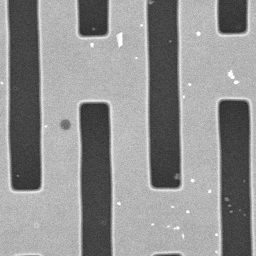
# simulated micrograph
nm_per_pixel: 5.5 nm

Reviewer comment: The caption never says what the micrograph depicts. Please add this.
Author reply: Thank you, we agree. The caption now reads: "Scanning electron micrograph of groups of lines, slits or small figures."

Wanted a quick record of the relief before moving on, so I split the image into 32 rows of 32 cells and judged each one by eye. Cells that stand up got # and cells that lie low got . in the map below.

#....#####....####....#####....#
#....#####....####....#####....#
#....#####....####....#####....#
#....#####....####....#####....#
#....#####...#####....##########
#....#############....##########
#....##############...##########
#....##############...##########
#....##############...##########
#....##############...##########
#....##############...##########
#....##############...##########
#....##############...######..##
#....#####....#####...#####....#
#....#####....#####...#####....#
#....#####....#####...#####....#
#....#####....#####...#####....#
#....#####....#####....####....#
#....#####....#####....#####...#
#....#####....#####....#####...#
#....#####....#####....#####...#
#....#####....#####....#####...#
#....#####....#####....#####...#
##...#####....#####...######...#
##########....##############...#
##########....##############...#
##########....##############...#
##########....##############...#
##########....##############...#
##########....##############...#
##########....##############...#
##########....##############....